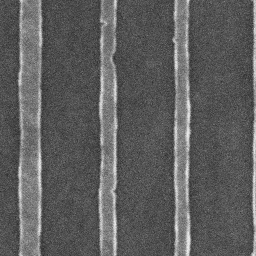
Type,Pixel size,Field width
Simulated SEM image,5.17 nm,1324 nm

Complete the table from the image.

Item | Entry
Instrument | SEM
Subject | one or a few lines or trenches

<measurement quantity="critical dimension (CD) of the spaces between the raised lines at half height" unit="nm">318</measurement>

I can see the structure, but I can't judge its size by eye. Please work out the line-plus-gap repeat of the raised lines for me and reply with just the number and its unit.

392 nanometres